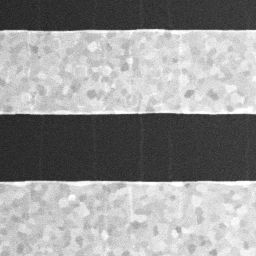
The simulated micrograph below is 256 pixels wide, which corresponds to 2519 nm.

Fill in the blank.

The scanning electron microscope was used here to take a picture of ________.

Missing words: wiring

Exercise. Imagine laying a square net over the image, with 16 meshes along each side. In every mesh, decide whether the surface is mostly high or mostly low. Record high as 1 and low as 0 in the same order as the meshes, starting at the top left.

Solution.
0000000000000000
0000000000000000
1111111111111111
1111111111111111
1111111111111111
1111111111111111
1111111111111111
0000000000000000
0000000000000000
0000000000000000
0000000000000000
1111111111111111
1111111111111111
1111111111111111
1111111111111111
1111111111111111